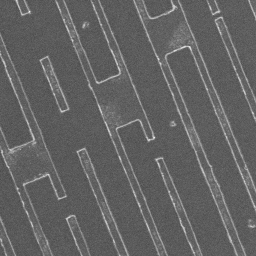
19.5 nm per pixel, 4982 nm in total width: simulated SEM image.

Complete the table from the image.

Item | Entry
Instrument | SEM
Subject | parallel lines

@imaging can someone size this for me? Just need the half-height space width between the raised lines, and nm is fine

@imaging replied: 514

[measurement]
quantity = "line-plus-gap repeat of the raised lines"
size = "0.69 microns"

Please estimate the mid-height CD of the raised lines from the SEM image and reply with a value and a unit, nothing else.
0.149 microns